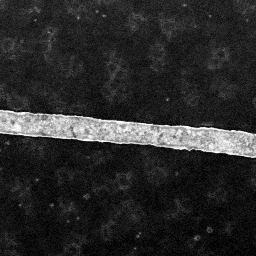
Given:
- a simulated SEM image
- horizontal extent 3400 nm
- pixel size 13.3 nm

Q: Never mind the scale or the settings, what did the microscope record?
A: one or a few lines or trenches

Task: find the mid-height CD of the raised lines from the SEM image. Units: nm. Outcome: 293